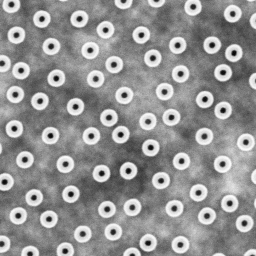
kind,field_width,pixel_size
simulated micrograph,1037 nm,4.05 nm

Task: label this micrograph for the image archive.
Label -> a regular array of ring-shaped raised bodies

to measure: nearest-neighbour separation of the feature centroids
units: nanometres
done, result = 105